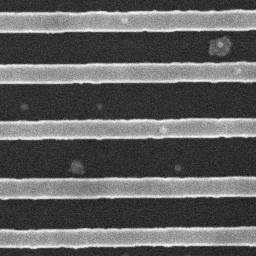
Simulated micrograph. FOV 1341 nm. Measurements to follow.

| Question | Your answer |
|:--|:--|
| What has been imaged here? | lines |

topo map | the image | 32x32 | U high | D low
DDDDDDDDDDDDDDDDDDDDDDDDDDDDDDDD
DDDDDDDDDDDDDDDDDDDUDUUUUDUDUUUU
UUUUUUUUUUUUUUUUUUUUUUUUUUUUUUUU
UUUUUUUUUUUUUUUUUUUUUUUUUUUUUUUU
DDDDDDDDDDDDDDDDDDDDDDDDDDDDDDDD
DDDDDDDDDDDDDDDDDDDDDDDDDDDUUDDD
DDDDDDDDDDDDDDDDDDDDDDDDDDDUDDDD
DDDDDDDDDDDDDDDDDDDDDDDDDDDDDDDD
UUUUUUUUUUUUUUUUUUUUUUUUUUUUUUUU
UUUUUUUUUUUUUUUUUUUUUUUUUUUUUUUU
DDDDDDDDDDDDDDDDDDDDDDDDDDDDDDDD
DDDDDDDDDDDDDDDDDDDDDDDDDDDDDDDD
DDDDDDDDDDDDDDDDDDDDDDDDDDDDDDDD
DDDDDDDDDDDDDDDDDDDDDDDDDDDDDDDD
DDDDDDDDDDDDDDDDDDDDDDDDDDDDDDDD
UUUUUUUUUUUUUUUUUUUUUUUUUUUUUUUU
UUUUUUUUUUUUUUUUUUUUUUUUUUUUUUUU
DDDDDDDDDDDDDDDDDDDDDDDDDDDDDDDD
DDDDDDDDDDDDDDDDDDDDDDDDDDDDDDDD
DDDDDDDDDDDDDDDDDDDDDDDDDDDDDDDD
DDDDDDDDDDDDDDDDDDDDDDDDDDDDDDDD
DDDDDDDDDDDDDDDDDDDDDDDDDDDDDDDD
UUUUUUUUUUUUUUUUUUUUUUUUUUUUUUUU
UUUUUUUUUUUUUUUUUUUUUUUUUUUUUUUU
UUUUUUUUUUUUUUUUUUUUUUUUUUUUUUUU
DDDDDDDDDDDDDDDDDDDDDDDDDDDDDDDD
DDDDDDDDDDDDDDDDDDDDDDDDDDDDDDDD
DDDDDDDDDDDDDDDDDDDDDDDDDDDDDDDD
DDDDDDDDDDDDDDDDDDDDDDDDDDDDDDUU
UUUUUUUUUUUUUUUUUUUUUUUUUUUUUUUU
UUUUUUUUUUUUUUUUUUUUUUUUUUUUUUUU
DDDDDDDDDDDDDDDDDDDDDDDDDDDDDDDD